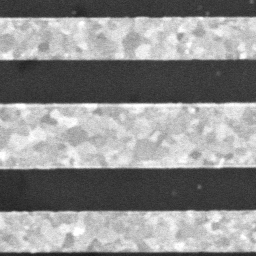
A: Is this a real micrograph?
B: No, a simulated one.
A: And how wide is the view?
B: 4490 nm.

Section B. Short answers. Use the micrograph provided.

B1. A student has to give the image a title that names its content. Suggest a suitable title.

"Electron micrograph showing lines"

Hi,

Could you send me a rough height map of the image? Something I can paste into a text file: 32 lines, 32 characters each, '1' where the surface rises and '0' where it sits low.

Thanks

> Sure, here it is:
00000000000000000000000000000000
00000000000000000000000000000000
11111111111111111111111111111111
11111111111111111111111111111111
11111111111111111111111111111111
11111111111111111111111111111111
11111111111111111111111111111111
00000000000000000000000000000000
00000000000000000000000000000000
00000000000000000000000000000000
00000000000000000000000000000000
00000000000000000000000000000000
00000000000000000000000000000000
11111111111111111111111111111111
11111111111111111111111111111111
11111111111111111111111111111111
11111111111111111111111111111111
11111111111111111111111111111111
11111111111111111111111111111111
11111111111111111111111111111111
11111111111111111111111111111111
00000000000000000000000000000000
00000000000000000000000000000000
00000000000000000000000000000000
00000000000000000000000000000000
00000000000000000000000000000000
01011111101111111111111111111111
11111111111111111111111111111111
11111111111111111111111111111111
11111111111111111111111111111111
11111111111111111111111111111111
00001000000000000000000000000000